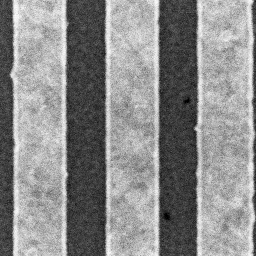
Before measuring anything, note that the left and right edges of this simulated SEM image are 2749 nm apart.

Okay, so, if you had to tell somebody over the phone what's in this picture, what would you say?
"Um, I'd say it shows one or a few lines or trenches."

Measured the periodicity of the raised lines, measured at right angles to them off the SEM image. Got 994 nm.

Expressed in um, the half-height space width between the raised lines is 0.464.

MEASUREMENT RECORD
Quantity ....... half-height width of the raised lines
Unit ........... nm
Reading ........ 528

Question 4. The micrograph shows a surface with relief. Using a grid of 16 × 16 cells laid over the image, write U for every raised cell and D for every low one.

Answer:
DUUUDDDUUUDDUUUU
DUUUDDDUUUDDUUUU
DUUUDDDUUUDDUUUU
DUUUDDDUUUDDUUUU
DUUUDDDUUUDDUUUU
DUUUDDDUUUDDUUUU
DUUUDDDUUUDDDUUU
DUUUDDDUUUDDUUUU
DUUUDDDUUUDDUUUU
DUUUDDDUUUDDUUUU
DUUUDDDUUUDDUUUU
DUUUDDDUUUDDUUUU
DUUUDDDUUUDDUUUU
DUUUDDDUUUDDUUUU
DUUUDDDUUUDDUUUU
DUUUDDDUUUDDUUUU